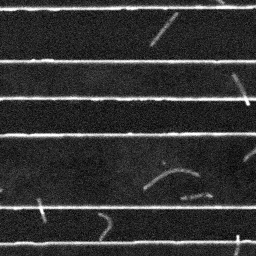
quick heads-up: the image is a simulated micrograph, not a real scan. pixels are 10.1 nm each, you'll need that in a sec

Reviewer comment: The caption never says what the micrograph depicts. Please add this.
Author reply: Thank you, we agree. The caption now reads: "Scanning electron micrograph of lines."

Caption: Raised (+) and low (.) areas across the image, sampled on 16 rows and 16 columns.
+++++++++.......
................
................
................
++++++++++++++++
++++++++++++++++
................
................
++++++++++++++++
++++++++++++++++
++++++++++++++++
++++++++++++++++
++++++++++++++++
................
................
++++++++++++++++